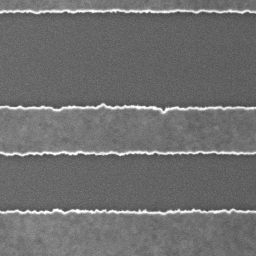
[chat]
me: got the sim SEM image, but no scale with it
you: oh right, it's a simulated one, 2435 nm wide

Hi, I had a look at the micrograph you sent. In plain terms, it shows one or a few lines or trenches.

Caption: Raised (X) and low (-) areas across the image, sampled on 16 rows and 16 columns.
XXXXXXXXXXXXXXXX
----------------
----------------
----------------
----------------
----------------
----------------
XXXXXXXXXXXXXXXX
XXXXXXXXXXXXXXXX
XXXXXXXXXXXXXXXX
----------------
----------------
----------------
XXXXXXXXXXXXXXXX
XXXXXXXXXXXXXXXX
XXXXXXXXXXXXXXXX